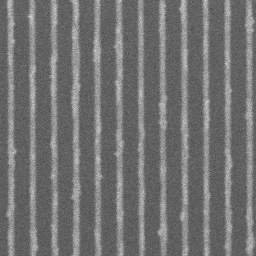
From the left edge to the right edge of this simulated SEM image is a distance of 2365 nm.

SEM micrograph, parallel lines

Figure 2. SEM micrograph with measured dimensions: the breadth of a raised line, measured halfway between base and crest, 40.4 nanometers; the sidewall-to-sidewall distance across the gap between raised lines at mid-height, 158 nanometers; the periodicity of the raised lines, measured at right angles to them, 0.201 um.